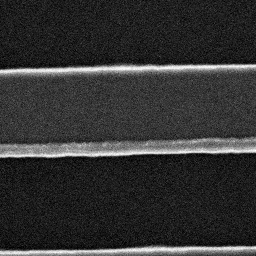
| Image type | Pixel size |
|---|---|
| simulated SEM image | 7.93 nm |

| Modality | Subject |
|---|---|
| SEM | lines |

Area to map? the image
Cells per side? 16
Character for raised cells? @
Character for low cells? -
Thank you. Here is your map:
----------------
----------------
----------------
----------------
@@@@@@@@@@@@@@@@
@@@@@@@@@@@@@@@@
@@@@@@@@@@@@@@@@
@@@@@@@@@@@@@@@@
@@@@@@@@@@@@@@@@
@@@@@@@@@@@@----
----------------
----------------
----------------
----------------
----------------
----------------